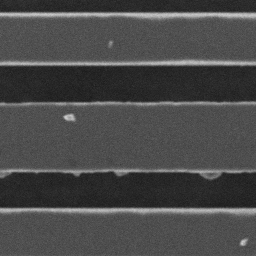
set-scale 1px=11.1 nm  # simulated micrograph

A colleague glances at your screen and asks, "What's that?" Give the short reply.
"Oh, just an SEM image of lines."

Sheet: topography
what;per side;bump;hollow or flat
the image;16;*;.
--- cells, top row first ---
................
****************
****************
****************
................
................
****************
****************
****************
****************
****************
................
................
****************
****************
****************